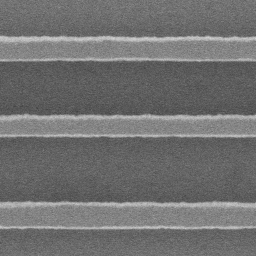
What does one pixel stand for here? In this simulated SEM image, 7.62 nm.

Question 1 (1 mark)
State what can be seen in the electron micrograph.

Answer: lines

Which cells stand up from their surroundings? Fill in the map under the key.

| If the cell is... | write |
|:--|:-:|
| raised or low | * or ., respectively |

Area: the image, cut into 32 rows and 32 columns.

................................
................................
................................
................................
................................
********************************
********************************
******..*...***.......********.*
................................
................................
................................
................................
................................
................................
..***..**..*..**.***..*..*****.*
********************************
********************************
................................
................................
................................
................................
................................
................................
................................
................................
********************************
********************************
********************************
........********...*...***..*...
................................
................................
................................